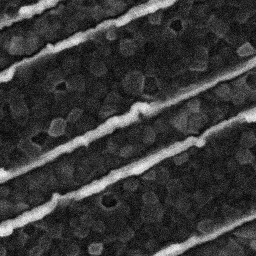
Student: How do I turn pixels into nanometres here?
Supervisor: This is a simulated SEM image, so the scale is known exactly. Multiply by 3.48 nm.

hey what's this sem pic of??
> one or a few lines or trenches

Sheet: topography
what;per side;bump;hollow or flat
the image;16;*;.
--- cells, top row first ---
***......*******
......**********
....************
..**************
***************.
*************...
**********......
********......**
******.......***
****......******
**......********
......**********
...*************
.***************
**************..
************....